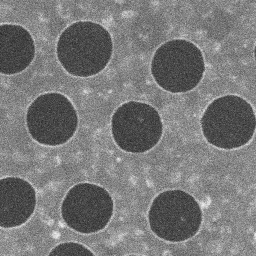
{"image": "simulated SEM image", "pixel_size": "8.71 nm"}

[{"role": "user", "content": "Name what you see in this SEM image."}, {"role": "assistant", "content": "holes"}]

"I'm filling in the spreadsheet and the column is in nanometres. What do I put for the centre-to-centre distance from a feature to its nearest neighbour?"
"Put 680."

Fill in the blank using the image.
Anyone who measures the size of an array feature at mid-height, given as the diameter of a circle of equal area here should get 53.3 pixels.